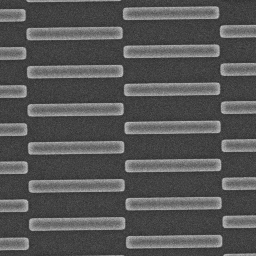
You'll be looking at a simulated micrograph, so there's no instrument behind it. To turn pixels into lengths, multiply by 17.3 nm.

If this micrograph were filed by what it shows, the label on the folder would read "groups of lines, slits or small figures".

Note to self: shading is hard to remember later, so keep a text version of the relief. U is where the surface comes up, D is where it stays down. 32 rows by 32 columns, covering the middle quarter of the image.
DUUUUUUUUUUUUUDDDDDDDDDDDDDDDDDD
UUUUUUUUUUUUUUUDDDDDDDDDDDDDDDDD
UUUUUUUUUUUUUUUDDDDDDDDDDDDDDDDD
DDDDDDDDDDDDDDDDDDDDDDDDDDDDDDDD
DDDDDDDDDDDDDDDDDDDDDDDDDDDDDDDD
DDDDDDDDDDDDDDDUUUUUUUUUUUUUUUUU
DDDDDDDDDDDDDDDUUUUUUUUUUUUUUUUU
DDDDDDDDDDDDDDDUUUUUUUUUUUUUUUUU
DDDDDDDDDDDDDDDDDDDDDDDDDDDDDDDD
DDDDDDDDDDDDDDDDDDDDDDDDDDDDDDDD
UUUUUUUUUUUUUUUDDDDDDDDDDDDDDDDD
UUUUUUUUUUUUUUUDDDDDDDDDDDDDDDDD
UUUUUUUUUUUUUUUDDDDDDDDDDDDDDDDD
DDDDDDDDDDDDDDDDDDDDDDDDDDDDDDDD
DDDDDDDDDDDDDDDDDDDDDDDDDUUUUUUU
DDDDDDDDDDDDDDDUUUUUUUUUUUUUUUUU
DDDDDDDDDDDDDDDUUUUUUUUUUUUUUUUU
DDDDDDDDDDDDDDDDDDDDDDDDDDDDDDDD
DDDDDDDDDDDDDDDDDDDDDDDDDDDDDDDD
DDDDDDDDDDDDUUUDDDDDDDDDDDDDDDDD
UUUUUUUUUUUUUUUDDDDDDDDDDDDDDDDD
UUUUUUUUUUUUUUUDDDDDDDDDDDDDDDDD
DDDDDDDDDDDDDDDDDDDDDDDDDDDDDDDD
DDDDDDDDDDDDDDDDDDDDDDDDDDDDDDDD
DDDDDDDDDDDDDDDUUUUUUUUUUUUUUUUU
DDDDDDDDDDDDDDDUUUUUUUUUUUUUUUUU
DDDDDDDDDDDDDDDUUUUUUUUUUUUUUUUU
DDDDDDDDDDDDDDDDDDDDDDDDDDDDDDDD
DDDDDDDDDDDDDDDDDDDDDDDDDDDDDDDD
UUUUUUUUUUUUUUUDDDDDDDDDDDDDDDDD
UUUUUUUUUUUUUUUDDDDDDDDDDDDDDDDD
UUUUUUUUUUUUUUUDDDDDDDDDDDDDDDDD